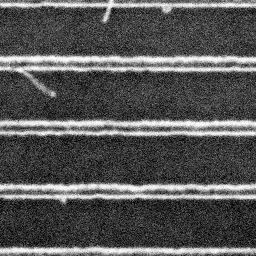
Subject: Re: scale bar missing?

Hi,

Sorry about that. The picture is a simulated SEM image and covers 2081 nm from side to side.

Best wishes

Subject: lines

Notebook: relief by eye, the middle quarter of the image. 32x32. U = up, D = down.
UUUUUUUUUUUUUUUUUUUUUUUUUUUUUUUU
DDDDDDDDDDDDDDDDDDDDDDDDDDDDDDDD
DDDDDDDDDDDDDDDDDDDDDDDDDDDDDDDD
DDDDDDDDDDDDDDDDDDDDDDDDDDDDDDDD
DDDDDDDDDDDDDDDDDDDDDDDDDDDDDDDD
DDDDDDDDDDDDDDDDDDDDDDDDDDDDDDDD
DDDDDDDDDDDDDDDDDDDDDDDDDDDDDDDD
DDDDDDDDDDDDDDDDDDDDDDDDDDDDDDDD
DDDDDDDDDDDDDDDDDDDDDDDDDDDDDDDD
DDDDDDDDDDDDDDDDDDDDDDDDDDDDDDDD
DDDDDDDDDDDDDDDDDDDDDDDDDDDDDDDD
DDDDDDDDDDDDDDDDDDDDDDDDDDDDDDDD
DDDDDDDDDDDDDDDDDDDDDDDDDDDDDDDD
DDDDDDDDDDDDDDDDDDDDDDDDDDDDDDDD
DDDDDDDDDDDDDDDDDDDDDDDDDDDDDDDD
UUUUUUUUUUUUUUUUUUUUUUUUUUUUUUUU
UUUUUUUUUUUUUUUUUUUUUUUUUUUUUUUU
DDDDDDDUUDDDDDDDDDUDUUDDDUDDDDDD
DDDDDDDDDDDDDDDDDDDDDDDDDDDDDDDD
DDDDDDDDDDDDDDDDDDDDDDDDDDDDDDDD
DDDDDDDDDDDDDDDDDDDDDDDDDDDDDDDD
DDDDDDDDDDDDDDDDDDDDDDDDDDDDDDDD
DDDDDDDDDDDDDDDDDDDDDDDDDDDDDDDD
DDDDDDDDDDDDDDDDDDDDDDDDDDDDDDDD
DDDDDDDDDDDDDDDDDDDDDDDDDDDDDDDD
DDDDDDDDDDDDDDDDDDDDDDDDDDDDDDDD
DDDDDDDDDDDDDDDDDDDDDDDDDDDDDDDD
DDDDDDDDDDDDDDDDDDDDDDDDDDDDDDDD
DDDDDDDDDDDDDDDDDDDDDDDDDDDDDDDD
DDDDDDDDDDDDDDDDDDDDDDDDDDDDDDDD
DDDDDDDDDDDDDDDDDDDDDDDDDDDDDDDD
UUUUUUUUUUUUUUUUUUUUUUUUUUUUUUUU